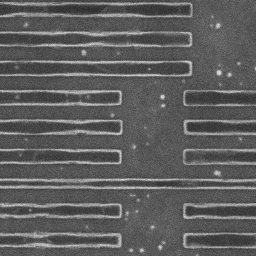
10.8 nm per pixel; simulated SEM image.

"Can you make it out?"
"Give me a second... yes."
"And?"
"wiring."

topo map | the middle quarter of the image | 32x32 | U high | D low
UUUUUUUUUUUUUUUUUUUUUUUUUUUUUUUU
UUUUUUUUUUUUUUUUUUUUUUUUUUUUUUUU
UUUUUUUUUUUUUUUUUUUUUUUUUUUUUUUU
DDDDDDDDDDDDDDDDDDDDDDDDDDDDDDDD
DDDDDDDDDDDDDDDDDDDDDDDDDDDDDDDD
DDDDDDDDDDDDDDDDDDDDDDDDDDDDDDDD
DDDDDDDDDDDDDDDDDDDDDDDDDDDDDDDD
UUUUUUUUUUUUUUDDDDDDDDDDDDDDDDUU
UUUUUUUUUUUUUUDDDDDDDDDDDDDDDDUU
UUUUUUUUUUUUUUDDDDDDDDDDDDDDDDUU
DDDDDDDDDDDDDDDDDDDDDDDDDDDDDDDD
DDDDDDDDDDDDDDDDDDDDDDDDDDDDDDDD
DDDDDDDDDDDDDDDDDDDDDDDDDDDDDDDD
DDDDDDDDDDDDDDDDDDDDDDDDDDDDDDDD
UUUDDUUUUUUUUUDDDDDDDDDDDDDDDDUU
UUUUUUUUUUUUUUDDDDDDDDDDDDDDDDUU
UUUUUUUUUUUUUUDDDDDDDDDDDDDDDDUU
DDDDDDDDDDDDDDDDDDDDDDDDDDDDDDDD
DDDDDDDDDDDDDDDDDDDDDDDDDDDDDDDD
DDDDDDDDDDDDDDDDDDDDDDDDDDDDDDDD
DDDDDDDDDDDDDDDDDDDDDDDDDDDDDDDD
DDDDDDDDDDDDDDDDDDDDDDDDDDDDDDDD
UUUUUUUUUUUUUUDDDDDDDDDDDDDDDDUU
UUUUUUUUUUUUUUDDDDDDDDDDDDDDDDUU
DDDDUUUUUUUUUUDDDDDDDDDDDDDDDDUU
DDDDDDDDDDDDDDDDDDDDDDDDDDDDDDDD
DDDDDDDDDDDDDDDDDDDDDDDDDDDDDDDD
DDDDDDDDDDDDDDDDDDDDDDDDDDDDDDDD
DDDDDDDDDDDDDDDDDDDDDDDDDDDDDDDD
UUUUUUUUUUUUUUUUUUUUUUUUUUUUUUUU
UUUUUUUUUUUUUUUUUUUUUUUUUUUUUUUU
DDDDDDDDDDDDDDDDDDDDDDDDDDDDDDDD